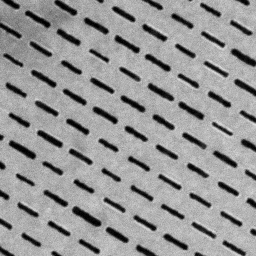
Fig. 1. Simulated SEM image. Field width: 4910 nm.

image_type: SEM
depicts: a regular array of holes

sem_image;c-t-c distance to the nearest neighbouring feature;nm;572